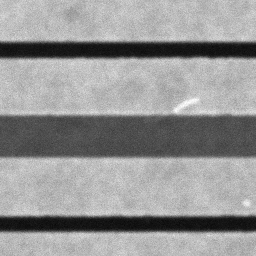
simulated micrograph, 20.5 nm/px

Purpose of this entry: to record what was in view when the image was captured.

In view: lines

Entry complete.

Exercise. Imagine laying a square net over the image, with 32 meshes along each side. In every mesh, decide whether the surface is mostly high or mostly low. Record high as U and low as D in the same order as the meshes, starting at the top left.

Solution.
UUUUUUUUUUUUUUUUUUUUUUUUUUUUUUUU
UUUUUUUUUUUUUUUUUUUUUUUUUUUUUUUU
UUUUUUUUUUUUUUUUUUUUUUUUUUUUUUUU
UUUUUUUUUUUUUUUUUUUUUUUUUUUUUUUU
UUUUUUUUUUUUUUUUUUUUUUUUUUUUUUUU
DDDDDDDDDDDDDDDDDDDDDDDDDDDDDDDD
DDDDDDDDDDDDDDDDDDDDDDDDDDDDDDDD
UUUUUUUUUUUUUUUUUUUUUUUUUUUUUUUU
UUUUUUUUUUUUUUUUUUUUUUUUUUUUUUUU
UUUUUUUUUUUUUUUUUUUUUUUUUUUUUUUU
UUUUUUUUUUUUUUUUUUUUUUUUUUUUUUUU
UUUUUUUUUUUUUUUUUUUUUUUUUUUUUUUU
UUUUUUUUUUUUUUUUUUUUUUUUUUUUUUUU
UUUUUUUUUUUUUUUUUUUUUUUUUUUUUUUU
DDDDDDDDDDDDDDDDDDDDDDDDDDDDDDDD
DDDDDDDDDDDDDDDDDDDDDDDDDDDDDDDD
DDDDDDDDDDDDDDDDDDDDDDDDDDDDDDDD
DDDDDDDDDDDDDDDDDDDDDDDDDDDDDDDD
DDDDDDDDDDDDDDDDDDDDDDDDDDDDDDDD
DDDDDDDDDDDDDDDDDDDDDDDDDDDDDDDD
UUUUUUUUUUUUUUUUUUUUUUUUUUUUUUUU
UUUUUUUUUUUUUUUUUUUUUUUUUUUUUUUU
UUUUUUUUUUUUUUUUUUUUUUUUUUUUUUUU
UUUUUUUUUUUUUUUUUUUUUUUUUUUUUUUU
UUUUUUUUUUUUUUUUUUUUUUUUUUUUUUUU
UUUUUUUUUUUUUUUUUUUUUUUUUUUUUUUU
UUUUUUUUUUUUUUUUUUUUUUUUUUUUUUUU
DDDDDDDDDDDDDDDDDDDDDDDDDDDDDDDD
DDDDDDDDDDDDDDDDDDDDDDDDDDDDDDDD
UUUUUUUUUUUUUUUUUUUUUUUUUUUUUUUU
UUUUUUUUUUUUUUUUUUUUUUUUUUUUUUUU
UUUUUUUUUUUUUUUUUUUUUUUUUUUUUUUU